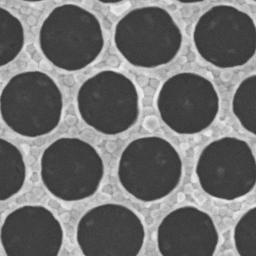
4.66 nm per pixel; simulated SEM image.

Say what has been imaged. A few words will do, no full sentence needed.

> holes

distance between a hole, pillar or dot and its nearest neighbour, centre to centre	354	nm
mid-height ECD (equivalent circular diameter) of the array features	295	nm